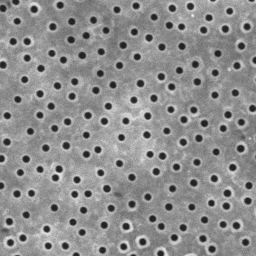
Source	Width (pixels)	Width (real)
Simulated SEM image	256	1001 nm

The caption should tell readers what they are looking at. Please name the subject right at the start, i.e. a regular array of holes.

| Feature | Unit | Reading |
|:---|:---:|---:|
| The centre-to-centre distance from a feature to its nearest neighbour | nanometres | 66.6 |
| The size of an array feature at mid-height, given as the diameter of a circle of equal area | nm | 29.3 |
